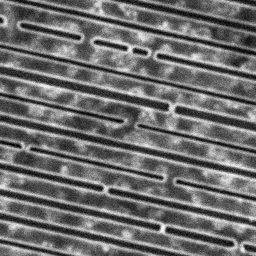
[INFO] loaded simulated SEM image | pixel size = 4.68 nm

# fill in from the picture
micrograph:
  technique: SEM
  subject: parallel lines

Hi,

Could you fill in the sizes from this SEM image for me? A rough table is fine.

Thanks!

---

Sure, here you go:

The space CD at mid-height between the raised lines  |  0.032 micrometres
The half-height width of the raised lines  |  77 nanometers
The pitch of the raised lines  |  112 nm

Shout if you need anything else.